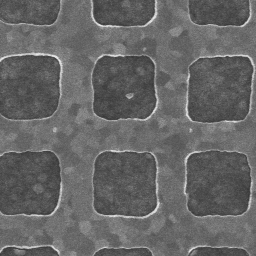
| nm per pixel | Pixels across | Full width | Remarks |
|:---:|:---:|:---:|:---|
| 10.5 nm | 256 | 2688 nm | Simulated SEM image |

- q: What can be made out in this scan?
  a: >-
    holes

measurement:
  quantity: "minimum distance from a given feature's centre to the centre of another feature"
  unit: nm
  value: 985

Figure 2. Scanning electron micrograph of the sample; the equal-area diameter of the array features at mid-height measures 736 nm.